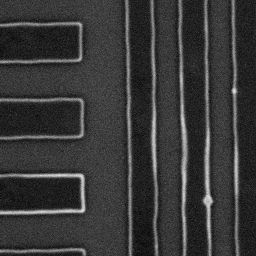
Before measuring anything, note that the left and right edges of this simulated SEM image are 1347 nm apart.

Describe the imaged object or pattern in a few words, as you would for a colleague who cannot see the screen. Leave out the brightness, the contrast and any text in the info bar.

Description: groups of lines, slits or small figures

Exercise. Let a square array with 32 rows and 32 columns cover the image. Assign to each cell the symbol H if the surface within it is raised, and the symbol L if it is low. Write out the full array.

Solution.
LLLLLLLLLLLLLLLLHHHLLLHHHHLLLHHH
LLLLLLLLLLLLLLLLHHHLLLLHHHLLLHHH
LLLLLLLLLLLLLLLLHHHLLLLHHHLLLHHH
HHHHHHHHHHLLLLLLHHHLLLHHHHLLLHHH
HHHHHHHHHHLLLLLLHHHLLLHHHHLLLHHH
HHHHHHHHHHLLLLLLHHHLLLLHHHLLLHHH
HHHHHHHHHHLLLLLLHHHLLLLHHHLLLHHH
HHHHHHHHHHLLLLLLHHHLLLLHHHLLLHHH
LLLLLLLLLLLLLLLLHHHLLLLHHHLLLHHH
LLLLLLLLLLLLLLLLHHHLLLLHHHLLLHHH
LLLLLLLLLLLLLLLLHHHLLLLHHHLLLHHH
LLLLLLLLLLLLLLLLHHHLLLLHHHLLLHHH
HHLLLLHHHHLLLLLLHHHLLLLHHHLLLHHH
HHHHHHHHHHLLLLLLHHHLLLLHHHLLLHHH
HHHHHHHHHHLLLLLLHHHLLLLHHHLLLHHH
HHHHHHHHHHLLLLLLHHHLLLLHHHLLLHHH
HHHHHHHHHHLLLLLLHHHLLLLHHHLLLHHH
LLLLLLLLLLLLLLLLHHHLLLLHHHLLLHHH
LLLLLLLLLLLLLLLLHHHLLLLHHHLLLHHH
LLLLLLLLLLLLLLLLHHHLLLLHHHLLLLHH
LLLLLLLLLLLLLLLLHHHLLLLHHHLLLLHH
LLLLLLLLLLLLLLLLHHHLLLLHHHLLLLHH
HHHHHHHHHHLLLLLLHHHLLLLHHHLLLLHH
HHHHHHHHHHLLLLLLHHHHLLLHHHLLLLHH
HHHHHHHHHHLLLLLLHHHHLLLHHHLLLLHH
HHHHHHHHHHLLLLLLHHHHLLLHHHLLLLHH
HHHHHHLLLLLLLLLLHHHHLLLHHHLLLLHH
LLLLLLLLLLLLLLLLHHHLLLLHHHLLLLHH
LLLLLLLLLLLLLLLLHHHLLLLHHHLLLHHH
LLLLLLLLLLLLLLLLHHHHLLLHHHLLLHHH
LLLLLLLLLLLLLLLLHHHHLLLHHHLLLLHH
HHHHHHHHHHLLLLLLHHHHLLLHHHLLLLHH